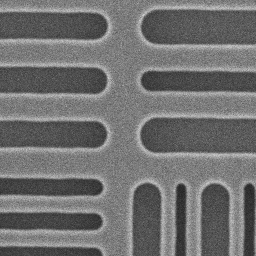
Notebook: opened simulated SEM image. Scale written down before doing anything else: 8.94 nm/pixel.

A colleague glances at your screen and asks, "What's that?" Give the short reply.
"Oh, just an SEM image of groups of lines, slits or small figures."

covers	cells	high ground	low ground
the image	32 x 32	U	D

UUUUUUUUUUUUUUUUUUUUUUUUUUUUUUUU
DDDDDDDDDDDDUUUUUUUDDDDDDDDDDDDD
DDDDDDDDDDDDDUUUUUDDDDDDDDDDDDDD
DDDDDDDDDDDDDUUUUUDDDDDDDDDDDDDD
DDDDDDDDDDDDDUUUUUDDDDDDDDDDDDDD
UUUUUUUUUUUUUUUUUUUDDDDDDDDDDDDD
UUUUUUUUUUUUUUUUUUUUUUUUUUUUUUUU
UUUUUUUUUUUUUUUUUUUUUUUUUUUUUUUU
DDDDDDDDDDDDUUUUUUUUUUUUUUUUUUUU
DDDDDDDDDDDDDUUUUUDDDDDDDDDDDDDD
DDDDDDDDDDDDDUUUUUDDDDDDDDDDDDDD
DDDDDDDDDDDDDUUUUUUDDDDDDDDDDDDD
UUUUUUUUUUUUUUUUUUUUUUUUUUUUUUUU
UUUUUUUUUUUUUUUUUUUUUUUUUUUUUUUU
UUUUUUUUUUUUUUUUUUUUUUUUUUUUUUUU
DDDDDDDDDDDDDUUUUUDDDDDDDDDDDDDD
DDDDDDDDDDDDDUUUUUDDDDDDDDDDDDDD
DDDDDDDDDDDDDUUUUUDDDDDDDDDDDDDD
DUUUUUDDDDUDUUUUUUDDDDDDDDDDDDDD
UUUUUUUUUUUUUUUUUUUUUUUUUUUUUUUU
UUUUUUUUUUUUUUUUUUUUUUUUUUUUUUUU
UUUUUUUUUUUUUUUUUUUUUUUUUUUUUUUU
DDDDDDDDDDDDUUUUUUUUUUUUUUUUUUUU
DDDDDDDDDDDDDUUUUDDDUUDUUUDDUUUD
UUUUUDDDDUUDUUUUUDDDUUDUUDDDDUDD
UUUUUUUUUUUUUUUUUDDDUUDUUDDDDUDD
UUUUUDDUUUUUUUUUUDDDUUDUUDDDDUDD
DDDDDDDDDDDDDUUUUDDDUUDUUDDDDUDD
DDDDDDDDDDDDUUUUDDDDUUDUUDDDDUDD
UUUUUUUUUUUUUUUUDDDDUUDUUDDDDUDD
UUUUUUUUUUUUUUUUUDDDUUDUUDDDDUDD
DDDDDDDDDDDDDUUUUDDDUUDUUDDDDUDD